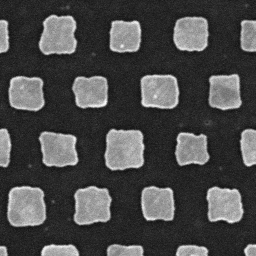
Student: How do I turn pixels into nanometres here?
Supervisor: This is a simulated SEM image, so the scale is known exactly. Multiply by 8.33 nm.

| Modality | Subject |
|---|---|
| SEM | a regular array of raised bodies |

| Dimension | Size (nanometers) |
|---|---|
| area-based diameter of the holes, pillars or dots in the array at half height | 300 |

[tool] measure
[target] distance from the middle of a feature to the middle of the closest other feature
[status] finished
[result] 538 nm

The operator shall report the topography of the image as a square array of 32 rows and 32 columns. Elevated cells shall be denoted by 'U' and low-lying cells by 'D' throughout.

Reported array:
DDDDDDDDDDDDDDDDDDDDDDDDDDDDDDDD
DDDDDDDDDDDDDDDDDDDDDDDDDDDDDDDD
DDDDDDUUUDDDDDDDDDDDDDUUUUDDDDDD
UDDDDDUUUDDDDDUUUDDDDDUUUUDDDDUU
UDDDDUUUUDDDDDUUUUDDDDUUUUDDDDUU
UDDDDUUUUDDDDDUUUDDDDDUUUUDDDDUU
DDDDDUUUUDDDDDDDDDDDDDDDDDDDDDDD
DDDDDDDDDDDDDDDDDDDDDDDDDDDDDDDD
DDDDDDDDDDDDDDDDDDDDDDDDDDDDDDDD
DDDDDDDDDDDDDDDDDDDUDDDDDDDDUUDD
DUUUUDDDDUUUUDDDDDUUUUDDDDUUUUDD
DUUUUDDDDUUUUDDDDDUUUUDDDDUUUUDD
DUUUUDDDDDUUUDDDDDUUUUDDDDUUUUDD
DDUUUDDDDDDDDDDDDDDDDDDDDDDUUDDD
DDDDDDDDDDDDDDDDDDDDDDDDDDDDDDDD
DDDDDDDDDDDDDDDDDDDDDDDDDDDDDDDD
UDDDDDDDDDDDDDUUUDDDDDDDDDDDDDDU
UDDDDUUUUDDDDUUUUUDDDDUUUUDDDDUU
UDDDDUUUUDDDDUUUUUDDDDUUUUDDDDUU
UDDDDUUUUUDDDUUUUUDDDDUUUUDDDDUU
UDDDDDUUUDDDDUUUUUDDDDDDDDDDDDDU
DDDDDDDDDDDDDDDDDDDDDDDDDDDDDDDD
DDDDDDDDDDDDDDDDDDDDDDDDDDDDDDDD
DDUUDDDDDDDUDDDDDDUUDDDDDDDDDDDD
DUUUUDDDDUUUUUDDDDUUUUDDDDUUUUDD
DUUUUUDDDDUUUUDDDDUUUUDDDDUUUUDD
DUUUUUDDDUUUUUDDDDUUUUDDDDUUUUDD
DUUUUDDDDUUUUDDDDDDDDDDDDDUDUUDD
DDDDDDDDDDDDDDDDDDDDDDDDDDDDDDDD
DDDDDDDDDDDDDDDDDDDDDDDDDDDDDDDD
DDDDDDDDDDDDDDDDDDDDDDDDDDDDDDDD
UDDDDUUUUUDDDUUUUUDDDDUUUUDDDDDU